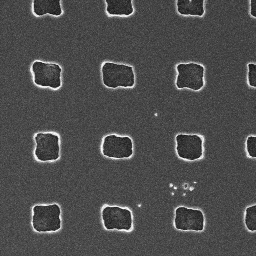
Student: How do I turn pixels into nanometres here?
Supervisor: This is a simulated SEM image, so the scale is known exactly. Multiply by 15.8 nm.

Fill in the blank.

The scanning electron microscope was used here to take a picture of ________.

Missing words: a regular array of holes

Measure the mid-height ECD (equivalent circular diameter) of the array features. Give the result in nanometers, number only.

441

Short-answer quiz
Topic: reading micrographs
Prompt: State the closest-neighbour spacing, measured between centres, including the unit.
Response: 1120 nanometres